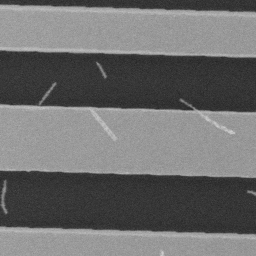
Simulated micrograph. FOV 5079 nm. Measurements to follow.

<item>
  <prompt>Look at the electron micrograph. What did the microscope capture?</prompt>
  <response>lines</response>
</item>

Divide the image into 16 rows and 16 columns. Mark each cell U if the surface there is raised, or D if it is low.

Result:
UUUUDDDDDDDDDDDD
UUUUUUUUUUUUUUUU
UUUUUUUUUUUUUUUU
DDDDDDDDDDDDDDDU
DDDDDDDDDDDDDDDD
DDDDDDDDDDDDDDDD
DDDDDDDDDDDDDDDD
UUUUUUUUUUUUUUUU
UUUUUUUUUUUUUUUU
UUUUUUUUUUUUUUUU
UUUUUUUUUUUUUUUU
DDDDDDDDDDDDDDDD
DDDDDDDDDDDDDDDD
DDDDDDDDDDDDDDDD
UUUUUUDDDDDDDDDD
UUUUUUUUUUUUUUUU